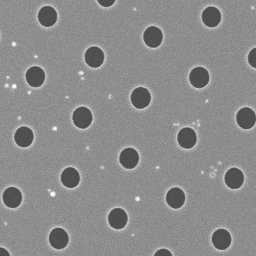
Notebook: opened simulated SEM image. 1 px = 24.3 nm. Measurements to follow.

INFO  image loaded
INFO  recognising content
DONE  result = a regular array of holes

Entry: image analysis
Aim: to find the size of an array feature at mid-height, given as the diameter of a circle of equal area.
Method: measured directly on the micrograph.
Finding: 0.504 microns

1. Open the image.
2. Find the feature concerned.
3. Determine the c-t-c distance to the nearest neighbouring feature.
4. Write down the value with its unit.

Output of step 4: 1490 nm